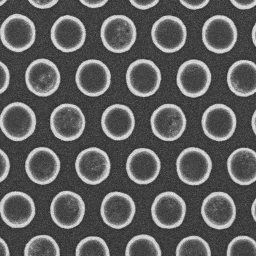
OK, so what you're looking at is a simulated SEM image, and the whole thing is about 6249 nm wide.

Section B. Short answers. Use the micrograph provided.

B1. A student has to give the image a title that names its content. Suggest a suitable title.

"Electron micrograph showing a regular array of raised bodies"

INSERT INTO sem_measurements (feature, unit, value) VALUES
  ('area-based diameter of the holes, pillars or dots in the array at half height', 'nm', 815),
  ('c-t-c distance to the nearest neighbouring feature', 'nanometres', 1220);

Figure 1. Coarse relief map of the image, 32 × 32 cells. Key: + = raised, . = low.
....+++....++....++....+++...+++
................................
.+++...+++....++....++....+++...
++++...+++...++++..++++...+++...
++++...+++...++++..++++...+++...
.+++...+++...+++....+++...+++...
................................
................................
+...+++...+++...+++....+++...+++
+..++++...++++..++++..++++...+++
+..++++...++++..++++..++++...+++
....++....+++....++....++....+++
................................
.++....+++....++....++....++....
++++..++++...+++...++++...+++...
++++..++++...++++..++++..++++...
.+++...+++...+++...++++...+++...
................................
................................
+...+++...+++...+++....+++...+++
+..++++...++++..++++..++++...+++
+...+++...+++...++++..++++...+++
....++.....++....++....++....+++
................................
.++....+++....++....++....++....
++++...+++...++++..++++...+++...
++++...+++...++++..++++..++++...
.+++...+++...+++....+++...+++...
................................
................................
+...+++...+++...++++...+++...+++
+..++++...+++...++++..++++...+++